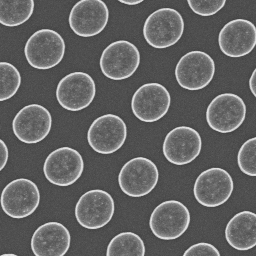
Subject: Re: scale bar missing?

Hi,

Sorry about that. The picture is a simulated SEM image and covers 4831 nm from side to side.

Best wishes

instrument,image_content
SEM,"a regular array of raised bodies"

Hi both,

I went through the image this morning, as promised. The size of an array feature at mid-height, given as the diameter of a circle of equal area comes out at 37.7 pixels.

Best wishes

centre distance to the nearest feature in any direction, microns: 0.994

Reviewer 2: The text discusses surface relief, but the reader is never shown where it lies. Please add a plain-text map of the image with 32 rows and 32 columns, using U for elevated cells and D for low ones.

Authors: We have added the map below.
UUUUDDDDDDUUUDDDDDDDDDDDUUUUDDDD
UUUUDDDDDUUUUDDDDDDDUUDDUUUDDDDD
UUUDDDDDDUUUUDDDDDUUUUUDDDDDDDDD
DDDDDDDDDUUUUDDDDDUUUUUDDDDDUUUU
DDDDUUUDDDDDDDDDDDUUUUDDDDDUUUUU
DDDUUUUUDDDDDDUUDDDUUUDDDDDDUUUU
DDDUUUUUDDDDDUUUUDDDDDDDUDDDUUUD
DDDDUUUUDDDDDUUUUDDDDDDUUUDDDDDD
UUDDDUDDDDDDDUUUUDDDDDUUUUUDDDDD
UUDDDDDDDUUDDUUUDDDDDDUUUUUDDDDD
UUDDDDDUUUUUDDDDDDDDDDDUUUDDDDDU
UUDDDDDUUUUUDDDDDUUUUDDDDDDDDDDD
DDDDDDDUUUUDDDDDDUUUUDDDDDDUUUDD
DDDUUDDDUUDDDDDDDUUUUDDDDDUUUUUD
DDUUUUDDDDDDDUDDDUUUDDDDDDUUUUUD
DDUUUUDDDDDDUUUDDDDDDDDDDDUUUUDD
DDUUUUDDDDDUUUUUDDDDDUUUDDDDDDDD
DDDUUDDDDDDUUUUUDDDDDUUUUDDDDDDU
UDDDDDDDDDDDUUUDDDDDUUUUUDDDDDUU
UDDDDDUUUUDDDDDDDDDDDUUUUDDDDDUU
UDDDDDUUUUDDDDDDUUUDDDDDDDDDDDUU
DDDDDDUUUUDDDDDUUUUUDDDDDDUUDDDU
DDUDDDUUUDDDDDDUUUUUDDDDDUUUUDDD
DUUUUDDDDDDDDDDUUUUDDDDDUUUUUDDD
UUUUUDDDDDUUUUDDDDDDDDDDUUUUUDDD
UUUUUDDDDDUUUUDDDDDDUUUDDDUDDDDD
DUUUDDDDDDUUUUDDDDDUUUUDDDDDDDDD
DDDDDDDDDDUUUUDDDDDUUUUUDDDDDUUU
DDDDDUUUDDDUDDDDDDDUUUUDDDDDUUUU
DDDDUUUUUDDDDDDUUDDDUUDDDDDDUUUU
DDDDUUUUUDDDDDUUUUDDDDDDDUDDDUUU
DDDDUUUUDDDDDUUUUUDDDDDUUUUDDDDD